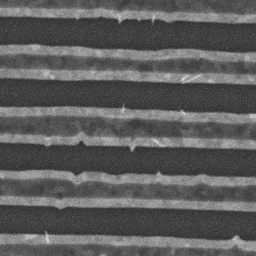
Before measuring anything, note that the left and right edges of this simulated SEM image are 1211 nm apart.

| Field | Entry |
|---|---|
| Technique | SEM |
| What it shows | one or a few lines or trenches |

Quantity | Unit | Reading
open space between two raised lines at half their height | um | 0.18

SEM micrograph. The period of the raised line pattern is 298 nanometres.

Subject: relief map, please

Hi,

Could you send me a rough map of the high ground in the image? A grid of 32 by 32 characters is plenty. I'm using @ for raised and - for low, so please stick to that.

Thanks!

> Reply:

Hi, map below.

@@@@@@@@@@@@@@@@@@@@@@@@@@@@@@@@
--@@@@@@@@@@@@@@@@@@@@@@@@@@@@@@
--------------------------------
--------------------------------
--------------------------------
--------------------------------
@@@@@@@@@@@---------------------
@@@@@@@@@@@@@@@@@@@@@@@@@@@@@@@@
@@@@@@@@@@@@@@@@@@@@@@@@@@@@@@@@
-----------------@-@@@@@@@@@@@@@
--------------------------------
--------------------------------
--------------------------------
--------------------------------
@@@@@@@@@@@@@@@@@@@@@-----------
@@@@@@@@@@@@@@@@@@@@@@@@@@@@@@@@
@@@@@@@@@@@@@@@@@@@@@@@@@@@@@@@@
-----@@-@@-@@@@@@@@@@@@@@@@@@@@@
--------------------------------
--------------------------------
--------------------------------
--------------------------------
@@@@@@@@@@@@@@-@@@@@@----@------
@@@@@@@@@@@@@@@@@@@@@@@@@@@@@@@@
@@@@@@@@@@@@@@@@@@@@@@@@@@@@@@@@
----------------------@@@@@@@@@@
--------------------------------
--------------------------------
--------------------------------
--------------------------------
@@@@@@@@@@@@@@@@@@@@@@@@-----@--
@@@@@@@@@@@@@@@@@@@@@@@@@@@@@@@@